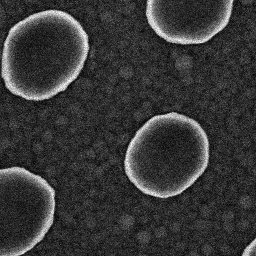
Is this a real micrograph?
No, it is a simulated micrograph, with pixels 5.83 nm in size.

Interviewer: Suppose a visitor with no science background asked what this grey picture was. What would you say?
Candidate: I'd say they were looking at raised bodies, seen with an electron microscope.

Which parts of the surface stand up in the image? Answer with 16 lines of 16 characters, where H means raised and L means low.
LLLLLLLLLHHHHHLL
LHHHHLLLLLHHHHLL
HHHHHLLLLLLHHLLL
HHHHHLLLLLLLLLLL
HHHHHLLLLLLLLLLL
LHHHLLLLLLLLLLLL
LLLLLLLLLLLLLLLL
LLLLLLLLLHHHLLLL
LLLLLLLLHHHHHLLL
LLLLLLLLHHHHHLLL
LLLLLLLLHHHHHLLL
HHHLLLLLHHHHLLLL
HHHLLLLLLLLLLLLL
HHHLLLLLLLLLLLLL
HHHLLLLLLLLLLLLL
HHLLLLLLLLLLLLLL